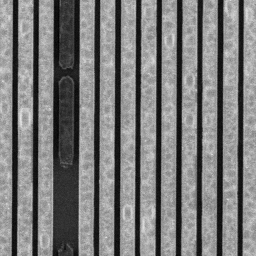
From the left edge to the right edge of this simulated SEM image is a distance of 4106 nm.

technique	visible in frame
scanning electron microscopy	parallel lines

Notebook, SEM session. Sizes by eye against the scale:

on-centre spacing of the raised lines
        328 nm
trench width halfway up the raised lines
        0.106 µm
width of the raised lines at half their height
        228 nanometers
